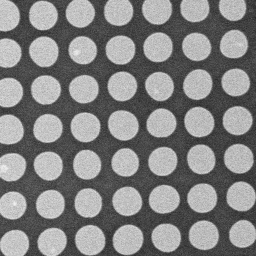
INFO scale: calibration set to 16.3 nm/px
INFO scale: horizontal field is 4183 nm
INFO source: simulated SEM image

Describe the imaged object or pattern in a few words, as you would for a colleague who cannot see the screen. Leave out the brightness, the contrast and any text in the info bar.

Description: an array of small figures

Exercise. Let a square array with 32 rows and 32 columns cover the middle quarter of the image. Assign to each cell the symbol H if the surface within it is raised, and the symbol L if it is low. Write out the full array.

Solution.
LLLLLLLLLLLLLLLLLLLLLLLLLLLLLLLL
LLLLLLLLLLLLLLLLLLLLLLLLLLLLLLLL
LLLLLLLLLLLLLHHHLLLLLLHHHLLLLLLH
LLLHHHHLLLLLHHHHHHLLLHHHHHHLLLHH
LLHHHHHHLLLHHHHHHHLLHHHHHHHLLLHH
LHHHHHHHLLLHHHHHHHLLHHHHHHHLLLHH
LHHHHHHHHLLHHHHHHHLLLHHHHHHLLLHH
LLHHHHHHLLLLHHHHHHLLLHHHHHHLLLHH
LLHHHHHHLLLLHHHHHLLLLLHHHHLLLLLL
LLLLHHLLLLLLLLLLLLLLLLLLLLLLLLLL
LLLLLLLLLLLLLLLLLLLLLLLLLLLLLLLL
LLLLLLLLLLLLLLLLLLLLLLLHHHLLLLLH
LLLLHHHLLLLLHHHHHLLLLLHHHHHLLLLH
LLHHHHHHLLLHHHHHHHLLLHHHHHHHLLHH
LLHHHHHHHLLHHHHHHHLLLHHHHHHHLLHH
LLHHHHHHHLLHHHHHHHHLLHHHHHHHLLHH
LLHHHHHHHLLHHHHHHHLLLHHHHHHHLLLH
LLHHHHHHHLLLHHHHHHLLLLHHHHHLLLLL
LLLHHHHHLLLLLHHHHLLLLLLLLLLLLLLL
LLLLLLLLLLLLLLLLLLLLLLLLLLLLLLLL
LLLLLLLLLLLLLLLLLLLLLLLLLLLLLLLL
LLLLLLLLLLLLLLHHHLLLLLLHHHHLLLLL
LLLHHHHHLLLLLHHHHHLLLLHHHHHHLLLH
LLLHHHHHHLLLHHHHHHLLLHHHHHHHLLLH
LLHHHHHHHLLLHHHHHHLLLHHHHHHHLLLH
LLHHHHHHHLLLHHHHHHLLLHHHHHHHLLLH
LLHHHHHHHLLLLHHHHHLLLLHHHHHLLLLL
LLLHHHHHLLLLLLHHHLLLLLLHHHLLLLLL
LLLLHHHLLLLLLLLLLLLLLLLLLLLLLLLL
LLLLLLLLLLLLLLLLLLLLLLLLLLLLLLLL
LLLLLLLLLLLLLLLLLLLLLLLLHHLLLLLL
LLLLLHHHLLLLLLHHHHLLLLHHHHHHLLLL